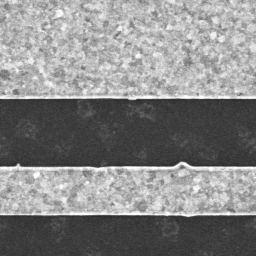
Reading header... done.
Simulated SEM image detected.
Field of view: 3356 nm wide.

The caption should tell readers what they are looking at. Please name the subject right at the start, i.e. one or a few lines or trenches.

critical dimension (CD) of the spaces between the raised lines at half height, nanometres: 914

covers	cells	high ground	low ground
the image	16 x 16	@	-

@@@@@@@@@@@@@@@@
@@@@@@@@@@@@@@@@
@@@@@@@@@@@@@@@@
@@@@@@@@@@@@@@@@
@@@@@@@@@@@@@@@@
@@@@@@@@@@@@@@@@
----------------
----------------
----------------
----------------
-@--------@@----
@@@@@@@@@@@@@@@@
@@@@@@@@@@@@@@@@
----------------
----------------
----------------